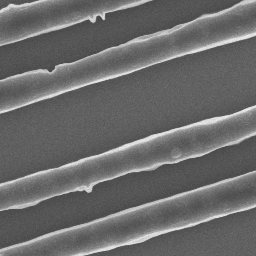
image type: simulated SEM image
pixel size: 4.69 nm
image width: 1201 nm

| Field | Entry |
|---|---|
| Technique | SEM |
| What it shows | one or a few lines or trenches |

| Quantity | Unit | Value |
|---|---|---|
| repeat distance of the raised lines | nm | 392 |